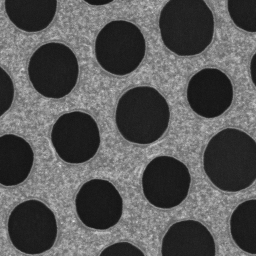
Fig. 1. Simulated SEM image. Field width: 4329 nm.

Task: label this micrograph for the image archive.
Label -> a regular array of holes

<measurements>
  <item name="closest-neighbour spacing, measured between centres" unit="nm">1190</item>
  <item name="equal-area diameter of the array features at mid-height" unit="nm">872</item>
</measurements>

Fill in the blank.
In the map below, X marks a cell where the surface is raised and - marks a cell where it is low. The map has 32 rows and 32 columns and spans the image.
X------XXXX--XXXXXXXX-----XX----
X------XXXXXXXXXXXXX------XXX---
X------XXXXXXXXXXXXX-------XX---
XX----XXXXXXX----XXX-------XXX--
XXXXXXXXXXXX------XX-------XXXXX
XXXXXX--XXXX------XXX-----XXXXXX
XXXX-----XXX------XXXX---XXXXXXX
XXXX------XX------XXXXXXXXXXXXX-
XXX-------XXX----XXXXXXXXXXXXXX-
-XXX------XXXXXXXXXXXXXX----XXX-
--XX-----XXXXXXXXXXXXXXX-----XXX
--XXX----XXXXXXX----XXX------XXX
--XXXXXXXXXXXXX------XX------XXX
-XXXXXXXXXXXXXX------XXX----XXXX
XXXXXXXX---XXX-------XXXX--XXXXX
XXXXXXX-----XXX------XXXXXXXXXXX
XXXXXX------XXX------XXXXXX----X
---XXX-------XXX----XXXXXX------
----XXX-----XXXXXXXXXXXXXX------
----XXX-----XXXXXXXX-XXXX-------
----XXXXXXXXXXXXXXX----XX-------
----XXXXXXXXXXXXXX------XX------
---XXXXXXXX--XXXXX------XX------
XXXXXXXXXX----XXXX------XXX----X
XXXXXXXXXX-----XXX-----XXXXXXXXX
XX---XXXX------XXXX---XXXXXXXX--
X------XXX-----XXXXXXXXXXXXXX---
X------XXX-----XXXXXXXXXXXXXX---
X------XXXX---XXXXXXX-----XXX---
X------XXXXXXXXXXXXXX------XX---
XX-----XXXXXXX--XXXX-------XXX--
XXX---XXXXXXX-----XX-------XXXX-